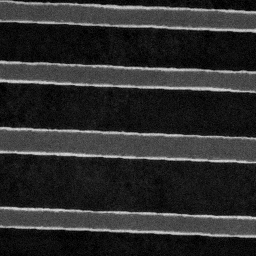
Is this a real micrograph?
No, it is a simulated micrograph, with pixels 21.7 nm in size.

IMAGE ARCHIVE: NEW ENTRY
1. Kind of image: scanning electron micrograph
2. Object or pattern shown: lines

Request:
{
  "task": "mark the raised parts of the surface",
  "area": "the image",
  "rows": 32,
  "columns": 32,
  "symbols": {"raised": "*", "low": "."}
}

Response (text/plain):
*********.......................
********************************
********************************
......................**********
................................
................................
................................
................................
*****************...............
********************************
........************************
................................
................................
................................
................................
................................
************....................
********************************
********************************
...........*********************
................................
................................
................................
................................
................................
................................
************....................
********************************
..******************************
...........................*****
................................
................................